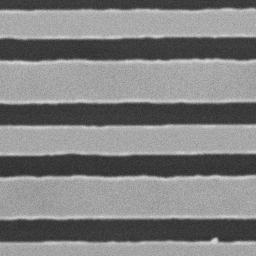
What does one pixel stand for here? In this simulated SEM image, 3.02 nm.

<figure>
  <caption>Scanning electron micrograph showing lines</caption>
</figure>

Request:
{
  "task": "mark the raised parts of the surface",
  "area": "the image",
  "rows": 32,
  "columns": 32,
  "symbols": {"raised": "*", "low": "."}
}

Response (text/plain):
................................
********************************
********************************
********************************
********************************
................................
................................
................................
********************************
********************************
********************************
********************************
********************************
................................
................................
................................
********************************
********************************
********************************
................................
................................
................................
********************************
********************************
********************************
********************************
********************************
................................
................................
................................
********************************
********************************